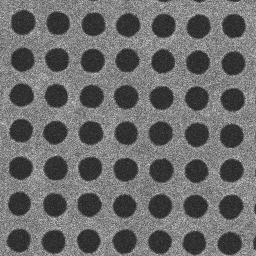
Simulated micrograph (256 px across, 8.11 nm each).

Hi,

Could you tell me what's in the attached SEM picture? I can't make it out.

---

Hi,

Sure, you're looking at a regular array of holes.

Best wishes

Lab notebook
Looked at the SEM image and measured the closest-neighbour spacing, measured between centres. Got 283 nm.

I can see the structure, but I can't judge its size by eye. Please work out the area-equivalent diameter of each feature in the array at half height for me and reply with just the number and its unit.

197 nanometres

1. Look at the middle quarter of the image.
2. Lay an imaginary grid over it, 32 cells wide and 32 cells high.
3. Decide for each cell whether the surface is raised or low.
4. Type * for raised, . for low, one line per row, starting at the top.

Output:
.***......***......***......***.
*****....*****....*****....****.
********************************
********************************
********************************
*****...*******..*******.*******
.****.....***.....****.....****.
.***......***......***.....***..
.***......***......**.......**..
.***......***.....***......***..
*****....****.....****.....****.
************************.*******
********************************
********************************
*****...******..*******...******
****.....****.....****.....****.
.***......***.....***......***..
.***......***......**......***..
.***......***.....***......***..
*****....*****....****....*****.
***********************.********
********************************
********************************
*****...*******..***************
.***.....****.....****.....****.
.***......**......***......***..
.***......**.......**.......**..
.***.....***......***......***..
*****....****.....****.....****.
***************.*******...******
********************************
********************************